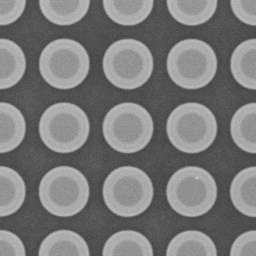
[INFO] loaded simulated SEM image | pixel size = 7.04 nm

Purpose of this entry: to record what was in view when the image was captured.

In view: an array of small figures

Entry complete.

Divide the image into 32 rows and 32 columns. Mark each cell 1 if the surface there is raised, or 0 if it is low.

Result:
11100111111001111110011111100111
11100111111001111110011111100111
11000011110000111100001111000011
00000000000000000000000000000000
00000000000000000000000000000000
11000011110000111100001111000011
11100111111001111110011111100111
11100111111001111110011111100111
11100111111001111110011111100111
11100111111001111110011111100111
11000011110000111100001111000011
00000000000000000000000000000000
00000000000000000000000000000000
11000011110000111100001111000011
11100111111001111110011111100111
11100111111001111110011111100111
11100111111001111110011111100111
11100111111001111110011111100111
11000011110000111100001111000011
00000000000000000000000000000000
00000000000000000000000000000000
11000011110000111100001111000011
11100111111001111110011111100111
11100111111001111110011111100111
11100111111001111110011111100111
11100111111001111110011111100111
11000011110000111100001111000011
00000000000000000000000000000000
00000000000000000000000000000000
11000011110000111100001111000011
11100111111001111110011111100111
11100111111001111110011111100111